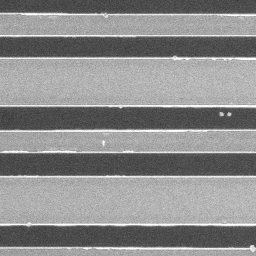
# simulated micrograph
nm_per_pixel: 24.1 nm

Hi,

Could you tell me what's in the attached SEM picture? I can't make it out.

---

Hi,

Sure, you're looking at lines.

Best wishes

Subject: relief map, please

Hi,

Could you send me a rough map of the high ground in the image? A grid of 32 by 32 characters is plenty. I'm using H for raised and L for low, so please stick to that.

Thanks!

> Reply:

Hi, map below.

HHHHHHHHHHHHHHHHHHHHHHHHHHHHHHHH
HHHHHHHHHHHHHHHHHHHHHHHHHHHHHHHH
LLLLLLLLLLLLLLLLLLLLLLLLLLLLLLLL
LLLLLLLLLLLLLLLLLLLLLLLLLLLLLLLL
LLLLLLLLLLLLLLLLLLLLLLLLLLLLLLLL
HHHHHHHHHHHHHHHHHHHHHHHHHHHHHHHH
HHHHHHHHHHHHHHHHHHHHHHHHHHHHHHHH
LLLLLLLLLLLLLLLLLLLLLLLLLLLLLLLL
LLLLLLLLLLLLLLLLLLLLLLLLLLLLLLLL
LLLLLLLLLLLLLLLLLLLLLLLLLLLLLLLL
LLLLLLLLLLLLLLLLLLLLLLLLLLLLLLLL
LLLLLLLLLLLLLLLLLLLLLLLLLLLLLLLL
LLLLLLLLLLLLLLLLLLLLLLLLLLLLLLLL
HHHHHHHHHHHHHHHHHHHHHHHHHHHHHHHH
HHHHHHHHHHHHHHHHHHHHHHHHHHHHHHHH
HHHHHHHHHHHHHHHHHHHHHHHHHHHHHHHH
LLLLLLLLLLLLLLLLLLLLLLLLLLLLLLLL
LLLLLLLLLLLLLLLLLLLLLLLLLLLLLLLL
LLLLLLLLLLLLLLLLLLLLLLLLLLLLLLLL
HHHHHHHHHHHHHHHHHHHHHHHHHHHHHHHH
HHHHHHHHHHHHHHHHHHHHHHHHHHHHHHHH
HHHHHHHHHHHHHHHHHHHHHHHHHHHHHHHH
LLLLLLLLLLLLLLLLLLLLLLLLLLLLLLLL
LLLLLLLLLLLLLLLLLLLLLLLLLLLLLLLL
LLLLLLLLLLLLLLLLLLLLLLLLLLLLLLLL
LLLLLLLLLLLLLLLLLLLLLLLLLLLLLLLL
LLLLLLLLLLLLLLLLLLLLLLLLLLLLLLLL
LLLLLLLLLLLLLLLLLLLLLLLLLLLLLLLL
HHHHHHHHHHHHHHHHHHHHHHHHHHHHHHHH
HHHHHHHHHHHHHHHHHHHHHHHHHHHHHHHH
HHHHHHHHHHHHHHHHHHHHHHHHHHHHHHHH
LLLLLLLLLLLLLLLLLLLLLLLLLLLLLLLL